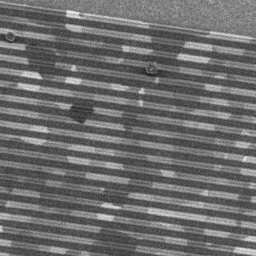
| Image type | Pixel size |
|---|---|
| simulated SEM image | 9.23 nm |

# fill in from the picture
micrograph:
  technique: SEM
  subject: parallel lines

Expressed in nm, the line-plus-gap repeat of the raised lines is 121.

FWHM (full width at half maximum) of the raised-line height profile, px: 4.58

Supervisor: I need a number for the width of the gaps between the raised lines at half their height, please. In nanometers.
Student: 75.4